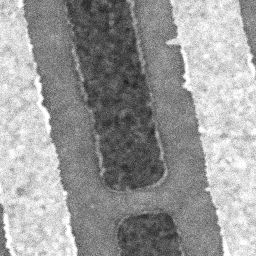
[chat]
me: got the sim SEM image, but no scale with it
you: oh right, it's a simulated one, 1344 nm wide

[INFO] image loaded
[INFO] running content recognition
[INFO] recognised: one or a few lines or trenches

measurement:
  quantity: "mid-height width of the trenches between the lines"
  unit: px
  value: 40.7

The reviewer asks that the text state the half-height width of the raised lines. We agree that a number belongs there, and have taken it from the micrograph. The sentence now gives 341 nm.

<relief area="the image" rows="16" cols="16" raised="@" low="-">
@---@@@@---@@@@-
@@--@@@@@--@@@@-
@@---@@@@--@@@@-
@@---@@@@--@@@@@
@@---@@@@---@@@@
@@@--@@@@---@@@@
@@@--@@@@@--@@@@
@@@---@@@@--@@@@
@@@---@@@@---@@@
@@@---@@@@---@@@
@@@@--@@@@---@@@
@@@@---@@@---@@@
@@@@---------@@@
@@@@----@@@---@@
@@@@---@@@@---@@
-@@@@--@@@@---@@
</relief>